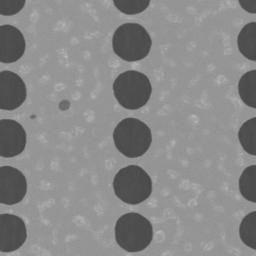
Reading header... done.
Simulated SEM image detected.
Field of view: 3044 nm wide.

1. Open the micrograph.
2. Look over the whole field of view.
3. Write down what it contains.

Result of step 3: holes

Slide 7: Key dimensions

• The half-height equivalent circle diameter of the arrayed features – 0.463 micrometres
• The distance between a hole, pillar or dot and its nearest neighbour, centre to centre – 0.563 µm